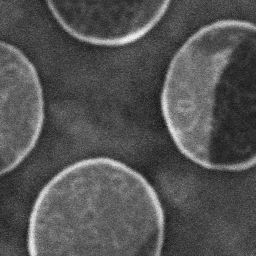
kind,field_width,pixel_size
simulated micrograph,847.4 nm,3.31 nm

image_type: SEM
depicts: raised bodies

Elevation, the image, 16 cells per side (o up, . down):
...ooooooo......
....oooooo....o.
.....ooo....oooo
o..........ooooo
oo.........ooooo
oo........oooooo
ooo.......oooooo
ooo.......oooooo
oo.........ooooo
oo..........oooo
o...oooo........
...oooooo.......
..oooooooo......
..oooooooo......
..oooooooo......
..oooooooo......